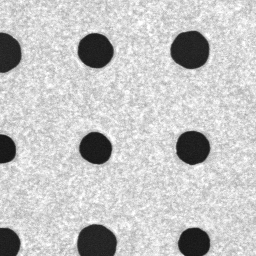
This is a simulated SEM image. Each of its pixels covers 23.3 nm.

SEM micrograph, holes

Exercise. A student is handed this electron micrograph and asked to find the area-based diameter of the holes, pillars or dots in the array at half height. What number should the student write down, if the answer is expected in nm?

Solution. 813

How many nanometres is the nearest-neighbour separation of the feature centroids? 2230